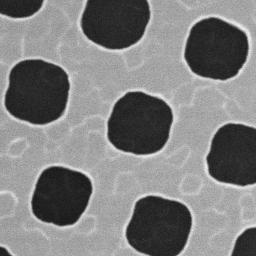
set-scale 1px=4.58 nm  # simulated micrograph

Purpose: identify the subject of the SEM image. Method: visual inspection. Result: holes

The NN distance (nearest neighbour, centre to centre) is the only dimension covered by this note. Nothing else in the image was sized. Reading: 489 nm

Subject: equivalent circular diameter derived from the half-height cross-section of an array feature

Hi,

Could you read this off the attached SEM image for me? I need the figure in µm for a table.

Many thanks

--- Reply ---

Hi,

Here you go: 0.295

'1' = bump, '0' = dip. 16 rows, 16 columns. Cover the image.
0011100001111111
1111100001110011
1111110001110001
1111111111110001
1000111111110001
0000111111111111
0000111000111111
1001111000011111
1111111000011000
1111111100111000
1110111111111000
1100001111111100
1100001110011111
1100011100001111
1111111100001110
1111111100011110